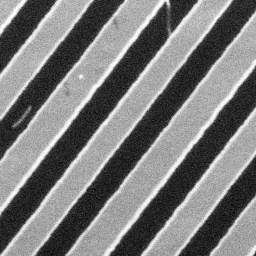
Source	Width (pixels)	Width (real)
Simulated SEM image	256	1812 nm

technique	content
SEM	lines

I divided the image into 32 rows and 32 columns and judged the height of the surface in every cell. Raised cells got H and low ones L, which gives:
HHHLLLLHHHHLLLLHHHHHLLLLLHHHHLLL
HHLLLLHHHHHLLLLHHHHLLLLLHHHHLLLL
HLLLLHHHHHLLLLHHHHHLLLLHHHHLLLLH
LLLLLHHHHLLLLHHHHHLLLLHHHHLLLLHH
LLLLHHHHLLLLHHHHHLLLLHHHHHLLLLHH
LLLHHHHLLLLHHHHHLLLLLHHHHLLLLHHH
LLHHHHHLLLLHHHHHLLLLHHHHLLLLHHHH
LHHHHHLLLLHHHHHLLLLHHHHLLLLHHHHH
LHHHHLLLLHHHHHLLLLHHHHLLLLHHHHHH
HHHHLLLLHHHHHLLLLLHHHHLLLLHHHHHL
HHHLLLLHHHHHLLLLLHHHHLLLLHHHHHLL
HHHLLLLHHHHHLLLLHHHHLLLLHHHHHLLL
HHLLLLHHHHHLLLLHHHHLLLLHHHHHLLLL
HLLLLHHHHHLLLLHHHHHLLLLHHHHHLLLL
LLLLHHHHHLLLLLHHHHLLLLHHHHHLLLLH
LLLLHHHHHLLLLHHHHLLLLHHHHHLLLLHH
LLLHHHHHLLLLHHHHLLLLHHHHHLLLLLHH
LLHHHHHLLLLHHHHLLLLLHHHHHLLLLHHH
LHHHHHLLLLLHHHHLLLLHHHHHLLLLHHHH
LHHHHLLLLLHHHHLLLLHHHHHLLLLHHHHH
HHHHHLLLLHHHHLLLLHHHHHLLLLLHHHHL
HHHHLLLLHHHHLLLLHHHHHLLLLLHHHHLL
HHHLLLLHHHHHLLLLHHHHHLLLLHHHHLLL
HHLLLLLHHHHLLLLHHHHHLLLLHHHHHLLL
HHLLLLHHHHLLLLHHHHHLLLLHHHHHLLLL
HLLLLHHHHLLLLHHHHHLLLLLHHHHLLLLH
LLLLHHHHLLLLLHHHHHLLLLHHHHLLLLHH
LLLLHHHHLLLLHHHHHLLLLHHHHHLLLLHH
LLLHHHHLLLLHHHHHLLLLHHHHHLLLLHHH
LLHHHHLLLLHHHHHLLLLLHHHHLLLLHHHH
LHHHHLLLLHHHHHLLLLLHHHHLLLLHHHHH
HHHHHLLLLHHHHHLLLLHHHHHLLLLHHHHH